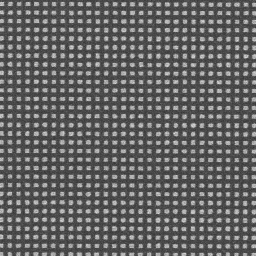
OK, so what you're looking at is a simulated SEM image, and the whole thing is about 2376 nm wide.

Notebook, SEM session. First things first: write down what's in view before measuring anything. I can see a regular array of raised bodies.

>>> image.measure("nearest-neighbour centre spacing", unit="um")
0.0754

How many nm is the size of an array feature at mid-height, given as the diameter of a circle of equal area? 41.9